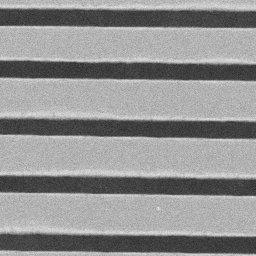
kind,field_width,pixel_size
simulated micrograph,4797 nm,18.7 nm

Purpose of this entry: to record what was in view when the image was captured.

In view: lines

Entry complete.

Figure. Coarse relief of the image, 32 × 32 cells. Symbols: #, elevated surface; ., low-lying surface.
################################
................................
................................
#########################.......
################################
################################
################################
################################
................................
................................
################################
################################
################################
################################
################################
................................
................................
################################
################################
################################
################################
################################
................................
................................
#############################...
################################
################################
################################
################################
........................#.######
................................
############....................